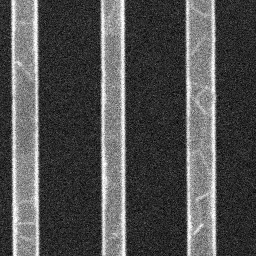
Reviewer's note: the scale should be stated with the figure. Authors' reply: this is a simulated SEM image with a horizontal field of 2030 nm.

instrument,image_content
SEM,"one or a few lines or trenches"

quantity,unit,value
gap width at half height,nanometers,520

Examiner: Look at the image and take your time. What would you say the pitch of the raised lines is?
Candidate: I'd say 696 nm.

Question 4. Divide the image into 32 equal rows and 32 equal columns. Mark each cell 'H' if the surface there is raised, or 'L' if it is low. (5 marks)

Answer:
LLHHLLLLLLLLLHHLLLLLLLLHHHHLLLLL
LLHHLLLLLLLLLHHLLLLLLLLHHHHLLLLL
LLHHLLLLLLLLLHHLLLLLLLLHHHHLLLLL
LLHHLLLLLLLLLHHLLLLLLLLHHHHLLLLL
LLHHLLLLLLLLLHHLLLLLLLLHHHHLLLLL
LLHHLLLLLLLLLHHLLLLLLLLHHHHLLLLL
LLHHLLLLLLLLLHHLLLLLLLLHHHHLLLLL
LLHHHLLLLLLLLHHLLLLLLLLHHHHLLLLL
LLHHHLLLLLLLLHHLLLLLLLLHHHHLLLLL
LLHHHLLLLLLLLHHLLLLLLLLHHHHLLLLL
LLHHHLLLLLLLLHHLLLLLLLLHHHHLLLLL
LLHHHLLLLLLLLHHLLLLLLLLHHHHLLLLL
LLHHHLLLLLLLLHHLLLLLLLLLHHHLLLLL
LLHHHLLLLLLLLHHLLLLLLLLLHHHLLLLL
LLHHHLLLLLLLLHHLLLLLLLLLHHHLLLLL
LLHHHLLLLLLLLHHLLLLLLLLLHHHLLLLL
LLHHHLLLLLLLLHHLLLLLLLLLHHHLLLLL
LLHHHLLLLLLLLHHLLLLLLLLLHHHLLLLL
LLHHHLLLLLLLLHHLLLLLLLLLHHHLLLLL
LLHHHLLLLLLLLHHLLLLLLLLLHHHLLLLL
LLHHHLLLLLLLLHHLLLLLLLLLHHHLLLLL
LLHHHLLLLLLLLHHLLLLLLLLLHHHLLLLL
LLHHHLLLLLLLLHHLLLLLLLLLHHHLLLLL
LLHHHLLLLLLLLHHLLLLLLLLLHHHLLLLL
LLHHHLLLLLLLLHHLLLLLLLLLHHHLLLLL
LLHHHLLLLLLLLHHLLLLLLLLLHHHLLLLL
LLHHHLLLLLLLLHHLLLLLLLLLHHHLLLLL
LLHHHLLLLLLLLHHLLLLLLLLLHHHLLLLL
LLHHHLLLLLLLLHHLLLLLLLLLHHHLLLLL
LLHHHLLLLLLLLHHLLLLLLLLLHHHLLLLL
LLHHHLLLLLLLLHHLLLLLLLLLHHHLLLLL
LLHHHLLLLLLLLHHLLLLLLLLLHHHLLLLL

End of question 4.